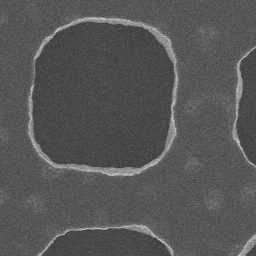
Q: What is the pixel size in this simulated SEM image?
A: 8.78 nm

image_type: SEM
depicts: holes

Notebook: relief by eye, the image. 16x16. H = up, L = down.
HHHHHHHHHHHHHHHH
HHHHHLLLHHHHHHHH
HHHLLLLLLLHHHHHH
HHLLLLLLLLLHHHHL
HHLLLLLLLLLHHHHL
HHLLLLLLLLLHHHHL
HHLLLLLLLLLHHHHL
HHLLLLLLLLLHHHHL
HHLLLLLLLLLHHHHL
HHHLLLLLLLHHHHHL
HHHHHHHLLHHHHHHH
HHHHHHHHHHHHHHHH
HHHHHHHHHHHHHHHH
HHHHHHHHHHHHHHHH
HHHHLLLLLHHHHHHH
HHHLLLLLLLHHHHHH